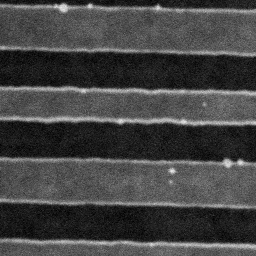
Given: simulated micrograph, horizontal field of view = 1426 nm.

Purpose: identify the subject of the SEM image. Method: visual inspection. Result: lines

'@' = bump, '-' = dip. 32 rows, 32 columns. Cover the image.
--------------------------------
@@@@@@@@@@@@@@@@@@@@@@@@@@@@@@@@
@@@@@@@@@@@@@@@@@@@@@@@@@@@@@@@@
@@@@@@@@@@@@@@@@@@@@@@@@@@@@@@@@
@@@@@@@@@@@@@@@@@@@@@@@@@@@@@@@@
@@@@@@@@@@@@@@@@@@@@@@@@@@@@@@@@
--------------------@@@@@@@@@@@@
--------------------------------
--------------------------------
--------------------------------
--------------------------------
@@@@@@@@@@@@@@@@@@@@@@@@@@@@@@@@
@@@@@@@@@@@@@@@@@@@@@@@@@@@@@@@@
@@@@@@@@@@@@@@@@@@@@@@@@@@@@@@@@
@@@@@@@@@@@@@@@@@@@@@@@@@@@@@@@@
-----------------------@@@-@@@@@
--------------------------------
--------------------------------
--------------------------------
--------------------------------
@@@@@@@@@@@@@@@@@@@@@@@@@@@@@@@@
@@@@@@@@@@@@@@@@@@@@@@@@@@@@@@@@
@@@@@@@@@@@@@@@@@@@@@@@@@@@@@@@@
@@@@@@@@@@@@@@@@@@@@@@@@@@@@@@@@
@@@@@@@@@@@@@@@@@@@@@@@@@@@@@@@@
---------------@@@@@@@@@@@@@@@@@
--------------------------------
--------------------------------
--------------------------------
--------------------------------
@@@@@@@@@@@@@@@@@@@@@@@@@-------
@@@@@@@@@@@@@@@@@@@@@@@@@@@@@@@@